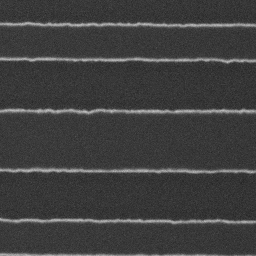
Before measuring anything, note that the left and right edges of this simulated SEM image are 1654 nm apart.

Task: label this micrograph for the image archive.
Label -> lines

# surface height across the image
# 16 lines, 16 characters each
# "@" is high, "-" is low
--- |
----------------
@@@-@@--@@------
@@@@@@@@@@@@@@@@
@@@@@@@@@@@@@@@@
----------------
----------------
----------------
@@@@@@@@@@@@@@@@
@@@@@@@@@@@@@@@@
@@@@@@@@@@@@@@@@
@@@@@@@@@@@@@@@@
----------------
----------------
----------------
@@@@@@@@@@@@@@@@
@@@@@@@@@@@@@@@@